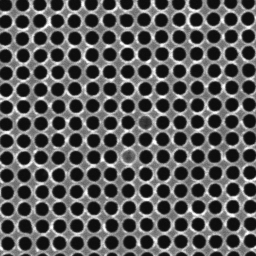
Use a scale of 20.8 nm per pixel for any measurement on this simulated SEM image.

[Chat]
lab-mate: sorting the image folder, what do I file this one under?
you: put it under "a regular array of holes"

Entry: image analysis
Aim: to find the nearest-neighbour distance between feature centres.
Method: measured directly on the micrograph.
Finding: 348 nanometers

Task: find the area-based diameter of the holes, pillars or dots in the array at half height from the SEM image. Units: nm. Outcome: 296